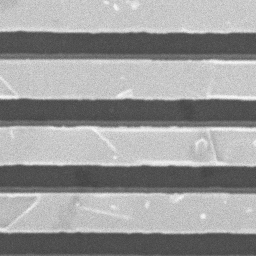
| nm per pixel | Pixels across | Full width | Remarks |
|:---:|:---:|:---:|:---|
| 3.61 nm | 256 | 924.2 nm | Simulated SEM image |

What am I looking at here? lines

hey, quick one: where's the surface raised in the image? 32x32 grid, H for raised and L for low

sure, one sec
HHHHHHHHHHHHHHHHHHHHHHHHHHHHHHHH
HHHHHHHHHHHHHHHHHHHHHHHHHHHHHHHH
HHHHHHHHHHHHHHHHHHHHHHHHHHHHHHHH
HHHHHHHHHHHHHHHHHHHHHHHHHHHHHHHH
LLLLLLLLLLLLLLLLLLLLLLLLLLLLLLLL
LLLLLLLLLLLLLLLLLLLLLLLLLLLLLLLL
LLLLLLLLLLLLLLLLLLLLLLLLLLLLLLLL
HHHHHHHHHHHHHHHHHHHHHHHHHHHHHHHH
HHHHHHHHHHHHHHHHHHHHHHHHHHHHHHHH
HHHHHHHHHHHHHHHHHHHHHHHHHHHHHHHH
HHHHHHHHHHHHHHHHHHHHHHHHHHHHHHHH
HHHHHHHHHHHHHHHHHHHHHHHHHHHHHHHH
LLLLLLLLLLLLLLLLLLLLLLLLLLLLLLLL
LLLLLLLLLLLLLLLLLLLLLLLLLLLLLLLL
LLLLLLLLLLLLLLLLLLLLLLLLLLLLLLLL
HHHHHHHHHHHHHHHHHHHHHHHHHHHHHHHH
HHHHHHHHHHHHHHHHHHHHHHHHHHHHHHHH
HHHHHHHHHHHHHHHHHHHHHHHHHHHHHHHH
HHHHHHHHHHHHHHHHHHHHHHHHHHHHHHHH
HHHHHHHHHHHHHHHHHHHHHHHHHHHHHHHH
HHHHHHHHHHHHHHHHHHHHHHHHHHHHHHHH
LLLLLLLLLLLLLLLLLLLLLLLLLLLLLLLL
LLLLLLLLLLLLLLLLLLLLLLLLLLLLLLLL
HHHHHLLLHHHLLHHLLLLLLLLLLLHHLLLL
HHHHHHHHHHHHHHHHHHHHHHHHHHHHHHHH
HHHHHHHHHHHHHHHHHHHHHHHHHHHHHHHH
HHHHHHHHHHHHHHHHHHHHHHHHHHHHHHHH
HHHHHHHHHHHHHHHHHHHHHHHHHHHHHHHH
HHHHHHHHHHHHHHHHHHHHHHHHHHHHHHHH
LLLLLLLLLLLLLLLLLLLLLLLLLLLLLLLL
LLLLLLLLLLLLLLLLLLLLLLLLLLLLLLLL
LLLLLLLLLLLLLLLLLLLLLLLLLLLLLLLL